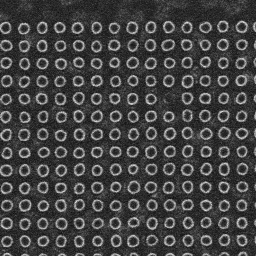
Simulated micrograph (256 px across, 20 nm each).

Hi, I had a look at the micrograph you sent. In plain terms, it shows a regular array of raised bodies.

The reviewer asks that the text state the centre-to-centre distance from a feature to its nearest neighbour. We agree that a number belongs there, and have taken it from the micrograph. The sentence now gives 0.346 micrometres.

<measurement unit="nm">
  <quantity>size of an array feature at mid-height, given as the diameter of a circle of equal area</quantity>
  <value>208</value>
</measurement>